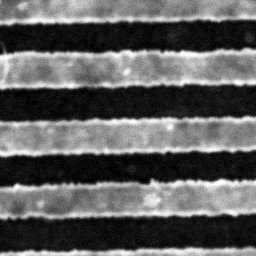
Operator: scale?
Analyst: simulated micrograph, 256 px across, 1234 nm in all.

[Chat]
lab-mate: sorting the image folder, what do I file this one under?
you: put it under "lines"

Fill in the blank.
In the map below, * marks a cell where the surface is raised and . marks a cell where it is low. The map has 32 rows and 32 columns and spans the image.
********************************
********************************
************************.*****..
................................
................................
................................
...*...........*********..******
********************************
********************************
********************************
***********************..***.***
................................
................................
................................
................................
********************************
********************************
********************************
********************************
*...............................
................................
................................
................................
********************************
********************************
********************************
********************************
................................
................................
................................
................................
...*.*...***********************